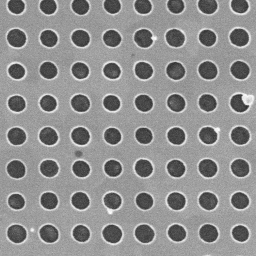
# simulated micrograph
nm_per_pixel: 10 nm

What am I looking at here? a regular array of holes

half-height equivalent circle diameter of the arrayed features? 187 nm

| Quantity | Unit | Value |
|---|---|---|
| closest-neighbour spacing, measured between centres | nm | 317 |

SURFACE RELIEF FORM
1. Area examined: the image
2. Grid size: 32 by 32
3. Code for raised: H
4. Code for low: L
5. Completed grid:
HLLHHLLHHLLHHLLHHLLHHLLHHLLHHLLH
HLLHHLLHHLLHHLLHHLLHHLLHHLLHHLLH
HHHHHHHHHHHHHHHHHHHHHHHHHHHHHHHH
HHHHHHHHHHHHHHHHHHHHHHHHHHHHHHHH
HLLHHLLHHLLHHLLHHLLHHLLHHLLHHLLH
HLLHHLLHHLLHHLLHHLLHHLLHHLLHHLLH
HHHHHHHHHHHHHHHHHHHHHHHHHHHHHHHH
HHHHHHHHHHHHHHHHHHHHHHHHHHHHHHHH
HLLHHLLHHLLHHLLHHLLHHLLHHLLHHLLH
HLLHHLLHHLLHHLLHHLLHHLLHHLLHHLLH
HHHHHHHHHHHHHHHHHHHHHHHHHHHHHHHH
HHHHHHHHHHHHHHHHHHHHHHHHHHHHHHHH
HLLHHLLHHLLHHLLHHLLHHLLHHLLHHLHH
HLLHHLLHHLLHHLLHHLLHHLLHHLLHHLLH
HHHHHHHHHHHHHHHHHHHHHHHHHHHHHHHH
HHHHHHHHHHHHHHHHHHHHHHHHHHHHHHHH
HLLHHLLHHLLHHLLHHLLHHLLHHLLHHLLH
HLLHHLLHHLLHHLLHHLLHHLLHHLLHHLLH
HHHHHHHHHHHHHHHHHHHHHHHHHHHHHHHH
HHHHHHHHHHHHHHHHHHHHHHHHHHHHHHHH
HLLHHLLHHLLHHLLHHLLHHLLHHLLHHLLH
HLLHHLLHHLLHHLLHHLLHHLLHHLLHHLLH
HHHHHHHHHHHHHHHHHHHHHHHHHHHHHHHH
HHHHHHHHHHHHHHHHHHHHHHHHHHHHHHHH
HLLHHLLHHLLHHLLHHLLHHLLHHLLHHLLH
HLLHHLLHHLLHHLLHHLLHHLLHHLLHHLLH
HHHHHHHHHHHHHHHHHHHHHHHHHHHHHHHH
HHHHHHHHHHHHHHHHHHHHHHHHHHHHHHHH
HLLHHLLHHLLHHLLHHLLHHLLHHLLHHLLH
HLLHHLLHHLLHHLLHHLLHHLLHHLLHHLLH
HHHHHHHHHHHHHHHHHHHHHHHHHHHHHHHH
HHHHHHHHHHHHHHHHHHHHHHHHHHHHHHHH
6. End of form